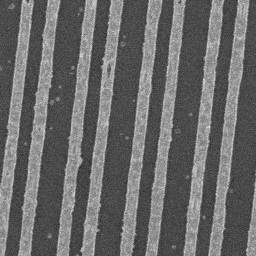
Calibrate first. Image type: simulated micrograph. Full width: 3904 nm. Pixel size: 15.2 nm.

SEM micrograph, parallel lines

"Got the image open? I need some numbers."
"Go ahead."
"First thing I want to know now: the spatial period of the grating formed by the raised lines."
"472 nm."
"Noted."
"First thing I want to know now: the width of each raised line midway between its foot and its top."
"167 nm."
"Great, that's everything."